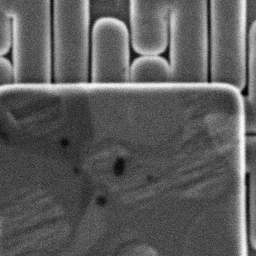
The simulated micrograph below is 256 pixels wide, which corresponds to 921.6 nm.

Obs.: wiring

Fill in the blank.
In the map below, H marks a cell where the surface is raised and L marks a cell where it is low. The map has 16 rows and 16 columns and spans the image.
LLLLLLLLLLLLLLLL
LLLLLLLLLLLLLLLL
LLLLLLLLLLLLLLLL
LLLLLLLLLLLLLLLL
LLLLLLLLLLLLLLLL
HHHHHHHHHHHHHHHL
HHHHHHHHHHHHHHHL
HHHHHHHHHHHHHHHL
HHHHHHHHHHHHHHHL
HHHHHHHHHHHHHHHL
HHHHHHHHHHHHHHHL
HHHHHHHHHHHHHHHL
HHHHHHHHHHHHHHHL
HHHHHHHHHHHHHHHL
HHHHHHHHHHHHHHHL
HHHHHHHHHHHHHHHL